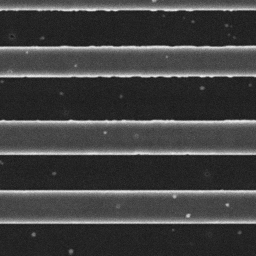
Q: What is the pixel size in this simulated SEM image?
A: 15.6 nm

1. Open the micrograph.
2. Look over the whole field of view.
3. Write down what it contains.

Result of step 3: lines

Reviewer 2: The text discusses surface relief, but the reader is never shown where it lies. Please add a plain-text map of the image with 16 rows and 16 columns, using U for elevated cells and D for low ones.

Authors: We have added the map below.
UUUUUUUUUUUUUUUU
DDDDDDDDDDDDDDDD
DDDDDDDDDDDDDDDD
UUUUUUUUUUUUUUUU
UUUUUUUUUUUUUUUU
DDDDDDDDDDDDDDDD
DDDDDDDDDDDDDDDD
DDDDDDDDDDDDDDDD
UUUUUUUUUUUUUUUU
UUUUUUUUUUUUUUUU
DDDDDDDDDDDDDDDD
DDDDDDDDDDDDDDDD
UUUUUUUUUUUUUUUU
UUUUUUUUUUUUUUUU
DDDDDDDDDDDDDDDD
DDDDDDDDDDDDDDDD